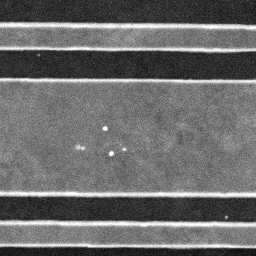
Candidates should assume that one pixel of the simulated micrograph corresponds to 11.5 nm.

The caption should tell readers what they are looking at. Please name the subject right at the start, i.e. lines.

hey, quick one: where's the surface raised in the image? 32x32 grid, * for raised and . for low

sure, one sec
................................
................................
................................
********************************
********************************
********************************
................................
................................
................................
................................
********************************
********************************
********************************
********************************
********************************
********************************
********************************
********************************
********************************
********************************
********************************
********************************
********************************
********************************
................................
................................
................................
................................
********************************
********************************
********************************
................................